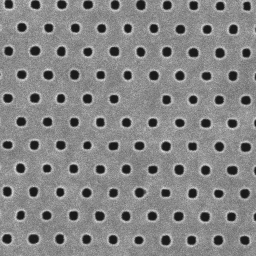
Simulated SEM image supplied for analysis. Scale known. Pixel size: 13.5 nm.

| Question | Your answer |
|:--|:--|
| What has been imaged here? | a regular array of holes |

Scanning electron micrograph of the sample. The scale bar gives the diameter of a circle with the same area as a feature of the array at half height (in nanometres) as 131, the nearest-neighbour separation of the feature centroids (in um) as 0.354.